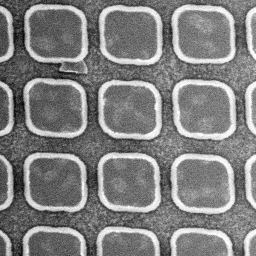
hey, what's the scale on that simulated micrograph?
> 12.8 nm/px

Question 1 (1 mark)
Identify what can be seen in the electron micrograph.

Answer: a regular array of raised bodies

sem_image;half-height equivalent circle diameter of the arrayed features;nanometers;780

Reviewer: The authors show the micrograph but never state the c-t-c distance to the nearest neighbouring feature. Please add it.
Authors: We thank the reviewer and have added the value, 940 nm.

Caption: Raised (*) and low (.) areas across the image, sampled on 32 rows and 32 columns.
................................
*...******...******...******....
*..*******...*******..*******..*
*..********..*******..*******..*
*..********..*******..*******..*
*..********..*******..*******..*
*...*******..*******..*******..*
.....*****....*****....*****....
................................
................................
....*****.....****.....****.....
*..*******...******...*******..*
*..********..*******..*******..*
*..********..*******..*******..*
*..********..*******..*******..*
*...*******..*******..*******..*
*....*****....*****....******...
................................
................................
.....***......****..............
*..*******...******...******...*
*..*******..********..*******..*
*..********..*******..*******..*
*..********..*******..*******..*
*..********..*******..*******..*
*...******...******...*******...
................................
................................
................................
*..*******...******...******...*
*..*******..********..*******..*
*..*******..********..*******..*